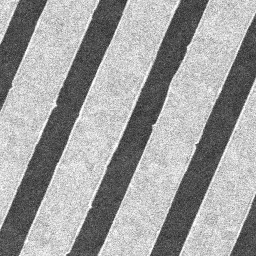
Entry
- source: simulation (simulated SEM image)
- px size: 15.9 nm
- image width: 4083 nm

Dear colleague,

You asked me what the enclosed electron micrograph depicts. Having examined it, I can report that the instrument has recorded one or a few lines or trenches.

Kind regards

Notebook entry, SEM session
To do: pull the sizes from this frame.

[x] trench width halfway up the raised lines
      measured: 465 nanometers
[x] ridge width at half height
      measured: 710 nm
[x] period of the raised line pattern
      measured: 1180 nm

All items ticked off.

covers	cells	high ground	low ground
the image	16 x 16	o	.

o..ooo..ooo..ooo
..ooo..ooo..oooo
..ooo..ooo..ooo.
..ooo..ooo..ooo.
.ooo..ooo..ooo..
.ooo..ooo..ooo..
ooo..ooo..ooo..o
ooo..ooo..ooo..o
oo..oooo.oooo..o
oo..ooo..ooo..oo
oo..ooo..ooo..oo
o..ooo..ooo..ooo
o..ooo..ooo..ooo
..ooo..ooo..ooo.
..ooo..ooo..ooo.
.ooo..oooo.oooo.